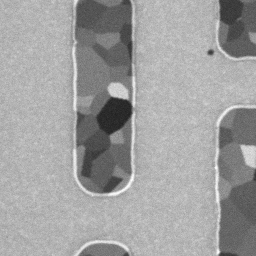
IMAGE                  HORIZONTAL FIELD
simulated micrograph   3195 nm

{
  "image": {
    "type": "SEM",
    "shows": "one or a few lines or trenches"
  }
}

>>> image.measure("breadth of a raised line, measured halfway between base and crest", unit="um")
0.738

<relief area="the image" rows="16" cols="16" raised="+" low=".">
.....+++......++
.....+++......++
.....+++......++
.....+++......++
.....+++........
.....+++........
.....+++........
.....+++......++
.....+++......++
.....+++......++
.....+++......++
.....+++......++
..............++
..............++
..............++
.....+++......++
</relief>